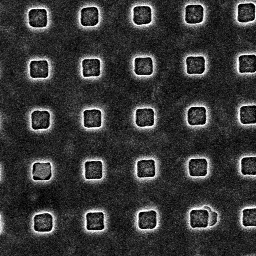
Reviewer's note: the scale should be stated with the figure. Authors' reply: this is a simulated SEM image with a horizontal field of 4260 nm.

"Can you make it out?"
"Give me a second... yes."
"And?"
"a regular array of holes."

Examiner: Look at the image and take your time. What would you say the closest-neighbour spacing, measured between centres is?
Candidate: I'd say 0.848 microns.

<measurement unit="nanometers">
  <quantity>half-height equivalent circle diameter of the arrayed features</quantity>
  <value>340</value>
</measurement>